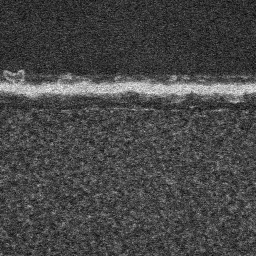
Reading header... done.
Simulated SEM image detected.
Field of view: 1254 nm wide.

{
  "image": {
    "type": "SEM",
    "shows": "one or a few lines or trenches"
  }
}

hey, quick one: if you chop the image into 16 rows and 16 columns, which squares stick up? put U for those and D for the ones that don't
UUUUUUUUUUUUUUUU
UUUUUUUUUUUUUUUU
UUUUUUUUUUUUUUUU
UUUUUUUUUUUUUUUU
UUUUUUUUUUUUUUUU
DUUUUUUUUUUUUUUU
DDDDDDDDDDDDDDDD
DDDDDDDDDDDDDDDD
DDDDDDDDDDDDDDDD
DDDDDDDDDDDDDDDD
DDDDDDDDDDDDDDDD
DDDDDDDDDDDDDDDD
DDDDDDDDDDDDDDDD
DDDDDDDDDDDDDDDD
DDDDDDDDDDDDDDDD
DDDDDDDDDDDDDDDD